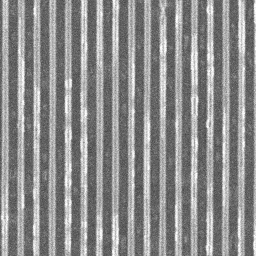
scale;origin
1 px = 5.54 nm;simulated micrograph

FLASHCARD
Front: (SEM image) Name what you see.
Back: parallel lines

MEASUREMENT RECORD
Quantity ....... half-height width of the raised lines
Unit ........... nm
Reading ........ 30.4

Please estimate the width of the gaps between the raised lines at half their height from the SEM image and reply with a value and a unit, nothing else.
55.4 nanometers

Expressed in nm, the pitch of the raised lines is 87.2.